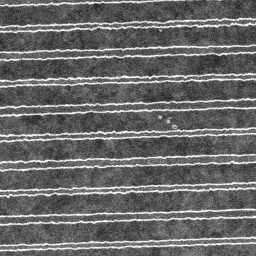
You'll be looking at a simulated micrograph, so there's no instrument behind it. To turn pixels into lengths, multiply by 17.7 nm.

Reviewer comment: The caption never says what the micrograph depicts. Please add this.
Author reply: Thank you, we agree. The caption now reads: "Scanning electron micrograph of parallel lines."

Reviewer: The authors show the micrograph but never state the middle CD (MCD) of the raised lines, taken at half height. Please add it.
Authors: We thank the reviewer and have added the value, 379 nm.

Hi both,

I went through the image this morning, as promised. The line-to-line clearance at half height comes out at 97.4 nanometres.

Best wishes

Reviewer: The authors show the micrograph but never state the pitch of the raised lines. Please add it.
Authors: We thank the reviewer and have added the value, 486 nm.